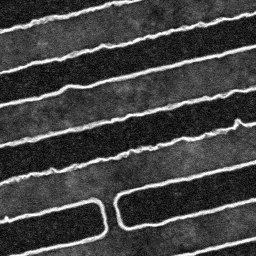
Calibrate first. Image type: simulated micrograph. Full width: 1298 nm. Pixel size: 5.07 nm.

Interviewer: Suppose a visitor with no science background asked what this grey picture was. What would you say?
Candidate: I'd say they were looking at one or a few lines or trenches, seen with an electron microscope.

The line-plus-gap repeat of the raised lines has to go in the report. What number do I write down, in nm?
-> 375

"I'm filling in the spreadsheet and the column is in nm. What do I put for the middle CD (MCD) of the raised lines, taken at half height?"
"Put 179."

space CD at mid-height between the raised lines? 196 nm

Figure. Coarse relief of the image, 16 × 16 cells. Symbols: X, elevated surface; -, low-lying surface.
XXXXXX----------
XX-----------XXX
---------XXXXXXX
----XXXXXXXXXX--
XXXXXXXXX-------
XXXX------------
X----------XXXXX
-------XXXXXXXXX
---XXXXXXXXXX---
XXXXXXXX--------
XXXXX---------XX
----------XXXXXX
-------XXXXXXXXX
-XXXXXXXXXXX----
XXXXXX----------
XXX----------XXX